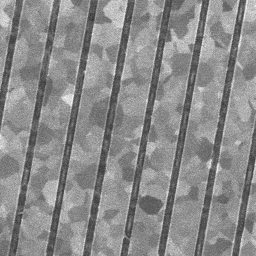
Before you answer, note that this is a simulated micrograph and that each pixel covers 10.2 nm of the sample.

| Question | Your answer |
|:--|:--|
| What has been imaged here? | parallel lines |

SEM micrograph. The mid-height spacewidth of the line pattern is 80.2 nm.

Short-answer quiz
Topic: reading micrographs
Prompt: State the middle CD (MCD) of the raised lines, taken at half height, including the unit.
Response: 290 nanometres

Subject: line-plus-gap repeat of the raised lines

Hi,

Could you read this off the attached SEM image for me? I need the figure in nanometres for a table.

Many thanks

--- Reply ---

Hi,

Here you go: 373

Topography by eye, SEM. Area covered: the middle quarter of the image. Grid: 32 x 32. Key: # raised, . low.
###...#######..#######..########
###..########..#######..#######.
###..########..#######..#######.
###..#######...#######..#######.
###..#######..#######...#######.
###..#######..#######..########.
##...#######..#######..########.
##..########..#######..#######..
##..########..#######..#######..
##..#######..########..#######..
##..#######..########..#######..
##..#######..#######..########..
##.########..#######..########.#
#..########..#######..#######..#
#..#######...#######..#######..#
#..#######..########..#######..#
#..#######..########.########..#
#..#######..#######..########..#
..########..#######..#######...#
..########..#######..#######..##
..#######...#######..#######..##
..#######..#######...#######..##
..#######..#######..########..##
..#######..#######..########.###
.########..#######..#######..###
.########..#######..#######..###
.#######..########..#######..###
.#######..########..#######..###
.#######..#######..########..###
########..#######..########.####
########..#######..#######..####
#######...#######..#######..####